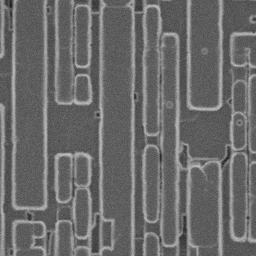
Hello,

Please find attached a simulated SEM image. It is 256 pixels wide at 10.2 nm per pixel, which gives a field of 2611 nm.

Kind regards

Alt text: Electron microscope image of wiring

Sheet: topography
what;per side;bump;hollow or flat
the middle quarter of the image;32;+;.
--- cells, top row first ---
++++++...++++++++...++++++++...+
++.......++++++++...++++++++...+
++.......++++++++...++++++++...+
++++++...++++++++...++++++++...+
++++++...++++++++...++++++++...+
+++++++..++++++++...++++++++...+
+++++++..++++++++...++++++++...+
+++++++..++++++++...++++++++...+
+++++++..++++++++...++++++++...+
++.+++...++++++++...++++++++...+
.........++++++++...++++++.+...+
.........++++++++...++++++++....
.........++++++++...++++++++....
.........++++++++...++++++++....
.........++++++++...++++++++....
.........++++++++...++++++++....
.........++++++++...++++++++....
.........++++++++....++.++++....
.........++++++++.......++++....
.........++++++++.......++++....
.........++++++++....++.++++....
.........++++++++...++++++++....
.........++++++++...++++++++....
++++++...++++++++...++++++++....
++++++...++++++++...++++++++....
++++++...++++++++...++++++++....
++++++...++++++++...++++++++...+
++++++...++++++++...++++++++...+
++++++...++++++++...++++++++...+
++.+++...++++++++...++++++++...+
++.+++...++++++++...++++++++...+
++.+++...++++++++...++++++++...+